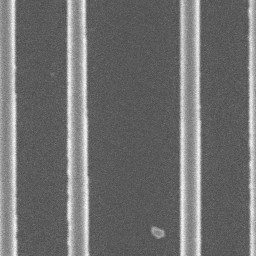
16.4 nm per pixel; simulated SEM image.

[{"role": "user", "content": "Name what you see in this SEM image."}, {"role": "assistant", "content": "lines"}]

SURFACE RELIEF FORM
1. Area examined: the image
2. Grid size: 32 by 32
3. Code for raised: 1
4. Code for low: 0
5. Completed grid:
11000000011000000000000110000001
11000000011000000000000110000001
11000000011000000000000110000001
11000000011000000000000110000001
11000000011000000000000110000001
11000000011000000000000110000001
11000000011000000000000110000001
11000000011000000000000110000001
11000000011000000000000110000001
11000000011000000000000110000001
11000000011000000000000110000001
11000000011000000000000110000001
11000000011000000000000110000001
11000000011000000000000110000001
11000000011000000000000110000001
11000000011000000000000110000001
11000000011000000000000110000001
11000000011000000000000110000001
11000000011000000000000110000001
11000000011000000000000110000001
11000000011000000000000110000001
11000000011000000000000110000001
11000000011000000000000110000001
11000000011000000000000110000001
11000000011000000000000110000001
11000000011000000000000110000001
11000000011000000000000110000001
11000000011000000000000110000001
11000000011000000000000110000001
11000000011000000000000110000001
11000000011000000000000110000001
11000000011000000000000110000001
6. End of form